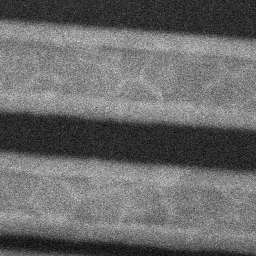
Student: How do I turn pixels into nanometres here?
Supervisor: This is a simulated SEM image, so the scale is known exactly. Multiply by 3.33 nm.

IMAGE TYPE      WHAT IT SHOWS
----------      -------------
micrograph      one or a few lines or trenches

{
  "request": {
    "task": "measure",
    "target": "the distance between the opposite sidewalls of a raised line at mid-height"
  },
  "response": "214 nm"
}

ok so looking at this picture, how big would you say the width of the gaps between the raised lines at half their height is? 211 nm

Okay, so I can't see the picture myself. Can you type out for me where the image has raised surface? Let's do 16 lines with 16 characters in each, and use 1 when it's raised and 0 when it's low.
0000000000000000
0000000000000000
1111111000000000
1111111111111111
1111111111111111
1111111111111111
0000111111111111
0000000000000000
0000000000000000
0000000000000000
1110000000000000
1111111111111111
1111111111111111
1111111111111111
0000000011111111
0000000000000000